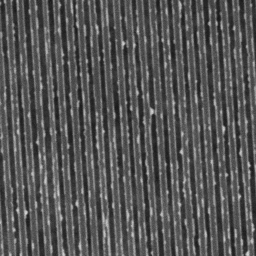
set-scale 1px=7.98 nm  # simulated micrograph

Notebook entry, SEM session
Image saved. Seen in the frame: parallel lines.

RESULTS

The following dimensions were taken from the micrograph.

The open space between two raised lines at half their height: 0.0388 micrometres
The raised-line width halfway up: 0.0538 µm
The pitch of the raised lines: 95.1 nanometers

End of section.